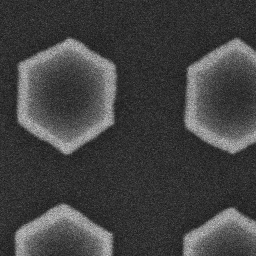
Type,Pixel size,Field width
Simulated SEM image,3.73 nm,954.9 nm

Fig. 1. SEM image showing raised bodies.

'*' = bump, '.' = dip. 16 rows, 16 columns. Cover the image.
................
................
................
...***.......***
.******.....****
.******.....****
.******.....****
.******.....****
...***.......***
................
................
................
................
...**.........*.
.*****......****
.******.....****